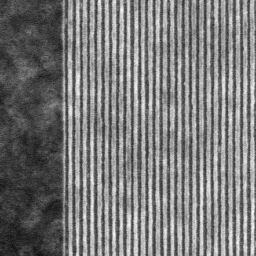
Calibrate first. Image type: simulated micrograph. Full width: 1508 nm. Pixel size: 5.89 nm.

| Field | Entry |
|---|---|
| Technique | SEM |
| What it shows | parallel lines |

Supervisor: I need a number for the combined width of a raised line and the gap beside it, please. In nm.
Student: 42.9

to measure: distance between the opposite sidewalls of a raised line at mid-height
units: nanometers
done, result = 20.6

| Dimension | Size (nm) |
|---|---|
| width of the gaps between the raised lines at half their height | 20.6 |